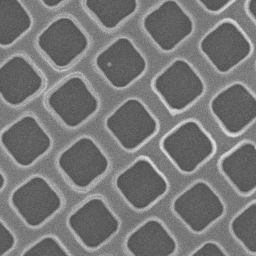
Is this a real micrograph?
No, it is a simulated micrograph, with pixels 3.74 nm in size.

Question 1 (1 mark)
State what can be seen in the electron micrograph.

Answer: a regular array of holes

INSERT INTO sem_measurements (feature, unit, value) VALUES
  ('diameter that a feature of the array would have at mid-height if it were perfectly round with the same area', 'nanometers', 168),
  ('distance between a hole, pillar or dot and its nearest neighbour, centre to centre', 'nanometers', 228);